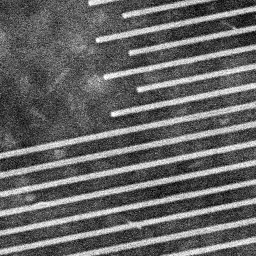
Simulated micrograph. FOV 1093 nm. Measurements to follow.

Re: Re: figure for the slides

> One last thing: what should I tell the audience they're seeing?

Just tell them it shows parallel lines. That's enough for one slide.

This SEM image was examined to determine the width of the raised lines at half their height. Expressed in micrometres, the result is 0.0188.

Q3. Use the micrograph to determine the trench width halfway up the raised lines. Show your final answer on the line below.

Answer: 0.0602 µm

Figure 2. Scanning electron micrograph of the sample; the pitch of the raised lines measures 80.7 nm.